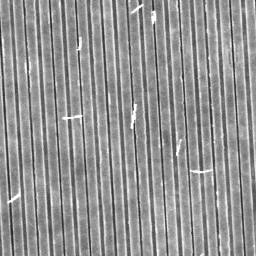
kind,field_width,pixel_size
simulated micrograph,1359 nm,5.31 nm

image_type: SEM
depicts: parallel lines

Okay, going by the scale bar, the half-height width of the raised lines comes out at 52.4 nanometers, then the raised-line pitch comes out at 68.1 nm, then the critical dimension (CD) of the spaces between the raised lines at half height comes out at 0.0146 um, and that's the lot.